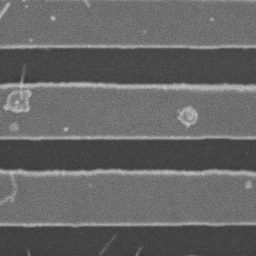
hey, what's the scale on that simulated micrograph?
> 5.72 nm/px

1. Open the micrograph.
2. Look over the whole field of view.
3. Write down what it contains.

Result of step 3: lines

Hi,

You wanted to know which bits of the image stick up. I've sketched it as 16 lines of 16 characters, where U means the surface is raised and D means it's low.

UUUUUUUUUUUUUUUU
UUUUUUUUUUUUUUUU
UUUUUUUUUUUUUUUU
DDDDDDDDDDDDDDDD
DDDDDDDDDDDDDDDD
UUUUUUUUUUUUUUUU
UUUUUUUUUUUUUUUU
UUUUUUUUUUUUUUUU
UUUUUUUUUUUUUUUU
DDDDDDDDDDDDDDDD
DDDDDDDDDDDDDDDD
UUUUUUUUUUUUUUUU
UUUUUUUUUUUUUUUU
UUUUUUUUUUUUUUUU
DDDDDDDDDDDDDDDD
DDDDDDDDDDDDDDDD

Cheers